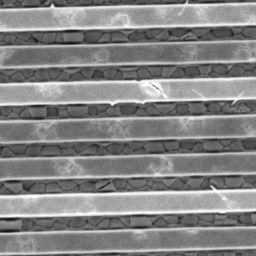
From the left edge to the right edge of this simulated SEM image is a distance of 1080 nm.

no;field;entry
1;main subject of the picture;parallel lines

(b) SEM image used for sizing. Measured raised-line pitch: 157 nanometres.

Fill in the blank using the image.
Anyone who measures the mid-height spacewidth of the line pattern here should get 66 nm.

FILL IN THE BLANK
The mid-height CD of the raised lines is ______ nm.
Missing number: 90.2